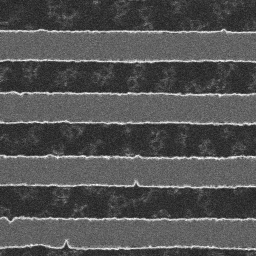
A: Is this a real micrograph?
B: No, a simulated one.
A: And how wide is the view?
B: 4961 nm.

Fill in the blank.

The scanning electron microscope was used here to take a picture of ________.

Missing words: one or a few lines or trenches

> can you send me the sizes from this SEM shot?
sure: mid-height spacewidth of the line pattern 564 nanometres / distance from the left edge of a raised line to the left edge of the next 1210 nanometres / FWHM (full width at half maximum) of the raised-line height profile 654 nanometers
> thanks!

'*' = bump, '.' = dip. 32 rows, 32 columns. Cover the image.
********************************
********************************
********************************
********************************
................................
................................
................................
...*............................
********************************
********************************
********************************
********************************
................................
................................
................................
***************************.*...
********************************
********************************
********************************
******.*************************
................................
................................
................................
********************************
********************************
********************************
********************************
.*..............................
................................
................................
................................
********************************